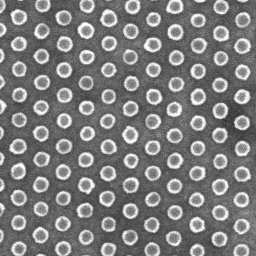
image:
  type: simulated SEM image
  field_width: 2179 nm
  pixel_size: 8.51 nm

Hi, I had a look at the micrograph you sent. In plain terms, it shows a regular array of raised bodies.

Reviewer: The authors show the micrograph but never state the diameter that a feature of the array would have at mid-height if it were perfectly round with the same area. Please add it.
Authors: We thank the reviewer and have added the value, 124 nm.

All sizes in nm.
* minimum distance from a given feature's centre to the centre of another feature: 213